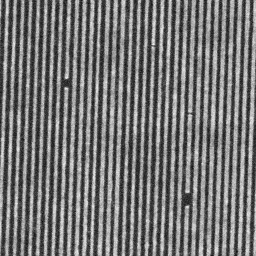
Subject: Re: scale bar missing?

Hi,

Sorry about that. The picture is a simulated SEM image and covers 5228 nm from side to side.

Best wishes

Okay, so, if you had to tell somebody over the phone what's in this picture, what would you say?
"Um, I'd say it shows parallel lines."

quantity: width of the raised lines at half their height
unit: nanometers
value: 53.6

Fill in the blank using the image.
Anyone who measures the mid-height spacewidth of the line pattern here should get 105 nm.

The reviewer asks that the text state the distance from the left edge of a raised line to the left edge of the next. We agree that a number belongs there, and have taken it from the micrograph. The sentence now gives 158 nanometres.